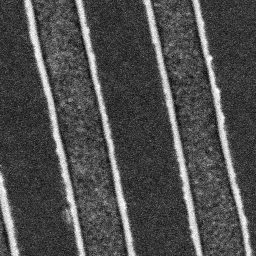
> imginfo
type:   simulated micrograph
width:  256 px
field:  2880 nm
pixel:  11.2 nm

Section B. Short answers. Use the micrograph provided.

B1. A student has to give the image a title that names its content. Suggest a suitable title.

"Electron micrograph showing one or a few lines or trenches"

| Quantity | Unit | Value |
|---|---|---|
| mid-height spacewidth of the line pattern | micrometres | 0.523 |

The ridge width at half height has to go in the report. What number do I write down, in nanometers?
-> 769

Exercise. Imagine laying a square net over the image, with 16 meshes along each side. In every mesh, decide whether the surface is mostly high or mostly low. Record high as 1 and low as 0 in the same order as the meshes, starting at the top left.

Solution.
1100011110001111
1100011111001111
1100011111000111
1100001111000111
1110001111000111
1110001111000111
1110001111100011
1110001111100011
1111000111100011
1111000111100011
1111000111100011
1111000111110001
1111100111110001
1111100011110001
0111100011110001
0111100011110001